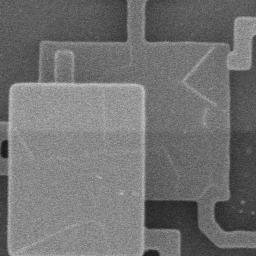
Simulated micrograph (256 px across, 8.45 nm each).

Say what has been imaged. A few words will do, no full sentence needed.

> wiring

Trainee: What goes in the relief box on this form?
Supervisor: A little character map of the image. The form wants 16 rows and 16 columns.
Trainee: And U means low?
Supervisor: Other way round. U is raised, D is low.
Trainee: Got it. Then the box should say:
DDDDDDDDDDDDDDDD
DDDDDDDDDDDDDDDD
DDDDDDDDDDDDDDDD
DDDDDDDDDDDDDDDD
DDDDDDDDDDDDDDDD
DUUUUUUUUDDDDDDD
DUUUUUUUUDDDDDDD
DUUUUUUUUDDDDDDD
DUUUUUUUUDDDDDDD
DUUUUUUUUDDDDDDD
DUUUUUUUUDDDDDDD
DUUUUUUUUDDDDDDD
DUUUUUUUUDDDDDDD
DUUUUUUUUDDDDDDD
UUUUUUUUUDDDDDDD
UUUUUUUUUDDDDDDD